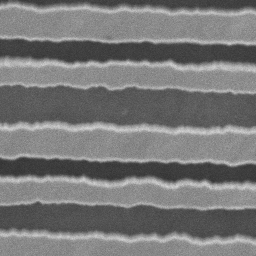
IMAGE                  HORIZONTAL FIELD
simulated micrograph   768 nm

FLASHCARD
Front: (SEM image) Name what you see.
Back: lines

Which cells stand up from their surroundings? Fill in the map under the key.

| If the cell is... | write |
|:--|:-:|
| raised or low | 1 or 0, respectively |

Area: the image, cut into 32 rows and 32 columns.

01100000000000000000000000000000
11111111111111111111111111111111
11111111111111111111111111111111
11111111111111111111111111111111
11111111111111111111111111111111
00000000000000000000000001001111
00000000000000000000000000000000
11111110000000000000000000000000
11111111111111111111111111111111
11111111111111111111111111111111
11111111111111111111111111111111
00000000000000000000000000011111
00000000000000000000000000000000
00000000000000000000000000000000
00000000000000000000000000000000
00000010000000000000000000000000
11111111111111111111111111111111
11111111111111111111111111111111
11111111111111111111111111111111
11111111111111111111111111111111
00000000000000000000000000001110
00000000000000000000000000000000
11111111111110011111001100000000
11111111111111111111111111111111
11111111111111111111111111111111
11110000001111111111111111111111
00000000000000000000000000000000
00000000000000000000000000000000
00000000000000000000000000000000
11111111111111100001011000000000
11111111111111111111111111111111
11111111111111111111111111111111